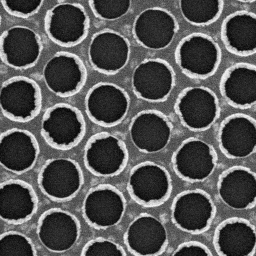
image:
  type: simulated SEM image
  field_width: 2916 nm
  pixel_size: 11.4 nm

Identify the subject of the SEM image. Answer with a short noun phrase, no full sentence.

a regular array of holes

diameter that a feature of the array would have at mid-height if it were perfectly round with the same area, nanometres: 436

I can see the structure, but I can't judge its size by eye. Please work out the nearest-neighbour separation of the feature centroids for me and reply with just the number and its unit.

576 nm